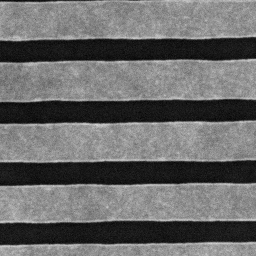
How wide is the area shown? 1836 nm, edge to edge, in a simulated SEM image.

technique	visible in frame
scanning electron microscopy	wiring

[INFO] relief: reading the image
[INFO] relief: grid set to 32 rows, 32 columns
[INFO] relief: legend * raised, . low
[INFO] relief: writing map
********************************
********************************
********************************
********************************
********************************
................................
................................
...............................*
********************************
********************************
********************************
********************************
*****************...............
................................
................................
.........*.....*****************
********************************
********************************
********************************
********************************
................................
................................
................................
********************************
********************************
********************************
********************************
**************.....***..***.....
................................
................................
.......................*********
********************************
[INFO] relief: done